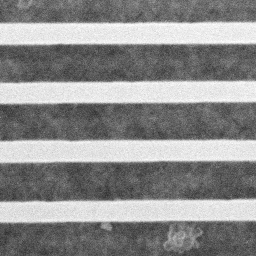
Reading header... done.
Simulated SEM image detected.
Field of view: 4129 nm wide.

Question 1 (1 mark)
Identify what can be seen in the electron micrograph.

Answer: lines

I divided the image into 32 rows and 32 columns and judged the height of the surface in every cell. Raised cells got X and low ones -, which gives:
--------------------------------
--------------------------------
--------------------------------
XXXXXXXXXXXXXXXXXXXXXXXXXXXXXXXX
XXXXXXXXXXXXXXXXXXXXXXXXXXXXXXXX
XXXX----------------------------
--------------------------------
--------------------------------
--------------------------------
--------------------------------
XXXXXXXXXXXXXXXXXXXXXXXXXXXXXXXX
XXXXXXXXXXXXXXXXXXXXXXXXXXXXXXXX
XXXXXXXXXXXXXXXXXXXXXXXXXXXXXXXX
--------------------------------
--------------------------------
--------------------------------
--------------------------------
--------------------------------
XXXXXXXXXXXXXXXXXXXXXXXXXXXXXXXX
XXXXXXXXXXXXXXXXXXXXXXXXXXXXXXXX
--------------------------------
--------------------------------
--------------------------------
--------------------------------
--------------------------------
XXXXXXXXXXXXXXXXXXXXXXXXXXXXXXXX
XXXXXXXXXXXXXXXXXXXXXXXXXXXXXXXX
XXXXXXXXXXXXXXXXXXXXXXXXXXXXXXXX
--------------------------------
--------------------------------
--------------------------------
--------------------------------